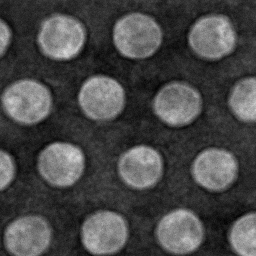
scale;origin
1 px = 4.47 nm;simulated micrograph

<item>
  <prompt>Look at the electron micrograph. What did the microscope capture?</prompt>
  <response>a regular array of raised bodies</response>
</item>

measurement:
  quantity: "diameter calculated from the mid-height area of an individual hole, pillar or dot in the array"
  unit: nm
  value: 201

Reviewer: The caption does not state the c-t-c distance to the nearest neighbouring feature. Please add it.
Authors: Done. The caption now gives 322 nm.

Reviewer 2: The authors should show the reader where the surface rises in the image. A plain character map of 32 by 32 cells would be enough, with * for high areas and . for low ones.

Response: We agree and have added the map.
................................
................................
......***......****......***....
*....*****....******....*****...
*....******...******....*****...
*....*****....******....*****...
.....*****.....****.....*****...
................................
................................
................................
..***......****......**.......**
.*****....*****.....*****....***
******....*****....******....***
.*****....*****....******....***
.*****.....***......****......**
.....................**.........
................................
................................
......****.......**.............
*....*****.....*****.....****...
**...*****.....*****....******..
**...*****.....*****....******..
*.....****.....*****.....****...
.................*........**....
................................
................................
.............*........**........
..***......*****....*****.....**
.*****....******....*****....***
.*****....******....*****....***
.*****.....*****....*****....***
.****......***.......***......**